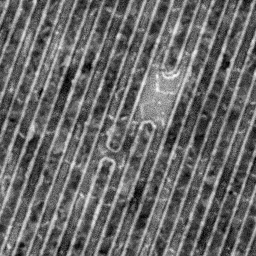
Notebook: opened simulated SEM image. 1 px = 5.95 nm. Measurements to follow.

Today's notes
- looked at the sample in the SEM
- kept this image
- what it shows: parallel lines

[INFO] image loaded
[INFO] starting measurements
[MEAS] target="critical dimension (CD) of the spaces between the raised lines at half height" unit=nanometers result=71.5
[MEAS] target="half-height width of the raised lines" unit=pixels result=13.8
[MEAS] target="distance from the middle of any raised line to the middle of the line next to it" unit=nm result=153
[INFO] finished